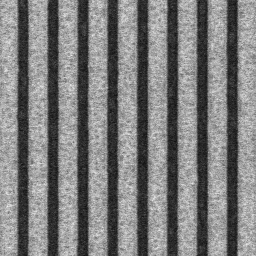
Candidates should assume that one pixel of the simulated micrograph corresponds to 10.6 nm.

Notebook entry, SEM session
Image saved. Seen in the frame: parallel lines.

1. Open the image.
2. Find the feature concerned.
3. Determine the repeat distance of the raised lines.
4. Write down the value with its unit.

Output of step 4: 0.317 micrometres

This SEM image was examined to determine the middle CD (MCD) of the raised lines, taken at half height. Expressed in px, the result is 18.4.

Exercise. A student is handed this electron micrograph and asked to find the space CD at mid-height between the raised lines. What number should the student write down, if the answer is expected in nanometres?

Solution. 121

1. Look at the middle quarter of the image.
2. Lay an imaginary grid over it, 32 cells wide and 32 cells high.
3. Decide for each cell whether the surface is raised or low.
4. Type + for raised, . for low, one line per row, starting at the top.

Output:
+++...+++++...++++...+++++...+++
+++...+++++...++++...+++++...+++
+++...+++++...++++...+++++...+++
+++...+++++...++++...+++++...+++
+++...+++++...++++...+++++...+++
+++...+++++...++++...+++++...+++
+++...+++++...++++...+++++...+++
+++...+++++...++++...+++++...+++
+++...+++++...++++...+++++...+++
+++...+++++...++++...+++++...+++
+++...+++++...++++...+++++...+++
+++...+++++...++++...+++++...+++
+++...+++++...++++...+++++...+++
+++...+++++...++++...+++++...+++
+++...+++++...++++...+++++...+++
+++...+++++...++++...+++++...+++
+++...+++++...++++...+++++...+++
+++...+++++...++++...+++++...+++
+++...+++++...++++...+++++...+++
+++...+++++...++++...+++++...+++
+++...+++++...++++...+++++...+++
+++...+++++...++++...+++++...+++
+++...+++++...++++...+++++...+++
+++...+++++...++++...++++....+++
+++...+++++...++++...+++++...+++
+++...+++++...++++...+++++...+++
+++...+++++...++++...+++++...+++
+++...+++++...++++...+++++...+++
+++...+++++...++++...+++++...+++
+++...+++++...++++...+++++...+++
+++...+++++...++++...+++++...+++
+++...+++++...++++...+++++...+++